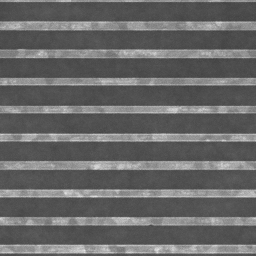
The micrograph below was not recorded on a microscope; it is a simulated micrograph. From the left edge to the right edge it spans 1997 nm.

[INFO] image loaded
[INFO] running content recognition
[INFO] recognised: parallel lines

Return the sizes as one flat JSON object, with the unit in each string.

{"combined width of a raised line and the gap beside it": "217 nm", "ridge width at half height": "0.0595 micrometres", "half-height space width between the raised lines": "159 nanometres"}